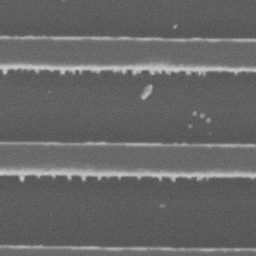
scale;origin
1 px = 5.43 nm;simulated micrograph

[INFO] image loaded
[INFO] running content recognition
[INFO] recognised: lines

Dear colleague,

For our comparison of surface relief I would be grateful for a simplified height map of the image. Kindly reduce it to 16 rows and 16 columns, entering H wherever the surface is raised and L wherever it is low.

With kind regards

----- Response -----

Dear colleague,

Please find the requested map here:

LLLLLLLLLLLLLLLL
LLLLLLLLLLLLLLLL
HHHHHHHHHHHHHHHH
HHHHHHHHHHHHHHHH
LLLLLLLLLLLLLLLL
LLLLLLLLLLLLLLLL
LLLLLLLLLLLLLLLL
LLLLLLLLLLLLLLLL
LLLLLLLLLLLLLLLL
HHHHHHHHHHHHHHHH
HHHHHHHHHHHHHHHH
LLLLLLLLLLLLLLLL
LLLLLLLLLLLLLLLL
LLLLLLLLLLLLLLLL
LLLLLLLLLLLLLLLL
HHHHHHHLLLLLLLLL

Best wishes